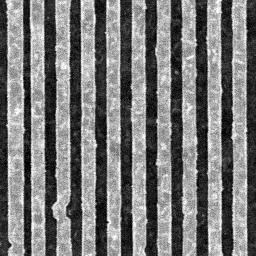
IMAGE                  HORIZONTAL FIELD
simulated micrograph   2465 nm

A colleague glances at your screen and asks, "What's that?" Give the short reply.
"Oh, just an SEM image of parallel lines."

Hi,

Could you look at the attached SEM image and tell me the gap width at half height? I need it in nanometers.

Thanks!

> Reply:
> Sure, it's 123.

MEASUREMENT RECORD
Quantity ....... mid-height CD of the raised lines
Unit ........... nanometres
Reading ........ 123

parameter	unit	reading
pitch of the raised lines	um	0.239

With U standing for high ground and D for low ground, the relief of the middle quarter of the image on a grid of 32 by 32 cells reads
UDDDDUUUDDDUUUDDDUUUDDDUUUDDDDUU
UDDDUUUUDDDUUUDDDUUUDDDUUUDDDDUU
UDDDDUUUDDDUUUDDDUUUDDDUUUDDDDUU
UDDDDUUUDDDUUUDDDUUUDDDUUUUDDDUU
UDDDDUUUDDDUUUDDDUUUDDDUUUUDDDUU
UDDDDUUUDDDUUUDDDUUUDDDUUUDDDDUU
UDDDDUUUDDDUUUDDDUUUDDDUUUDDDDUU
UDDDDUUUDDDUUUDDDUUUDDDUUUDDDDUU
UDDDDUUUDDDUUUDDDUUUDDDUUUDDDDUU
UDDDDUUUDDDUUUDDDUUUDDDDUUDDDDUU
UDDDDUUUDDDUUUDDDUUUDDDDUUDDDDUU
UDDDDUUUDDDUUUDDDUUUDDDDUUDDDDUU
UDDDDUUUDDDUUUDDDUUUDDDDUUDDDDUU
UDDDDUUUDDDUUUDDDUUUDDDUUUDDDDUU
UDDDDUUUDDDUUUDDDUUUDDDUUUUDDDUU
UDDDDUUUDDDUUUDDDUUUDDDDUUUDDDUU
UDDDDUUUDDDUUUDDDUUUDDDDUUUDDDUU
UDDDDUUUDDDUUUDDDUUUDDDDUUUDDDUU
UDDDDUUUDDDUUUDDDUUUDDDDUUUDDDUU
UDDDUUUUDDDUUUDDDUUUDDDDUUUDDDUU
UDDDUUUUDDDUUUDDDUUUDDDDUUDDDDUU
UDDDUUUUDDDUUUDDDUUUDDDDUUDDDDUU
UDDDUUUUDDDUUUDDDUUUDDDDUUDDDDUU
UDDDDUUUDDDUUUDDDUUUDDDUUUDDDDUU
UDDDDUUUDDDUUUDDDUUUDDDUUUUDDDUU
UDDDUUUUDDDUUUDDDUUUDDDUUUUDDDUU
UDDDUUUUDDDUUUDDDUUUDDDDUUUDDDUU
UDDDDUUUDDDUUUDDDUUUDDDDUUUDDDUU
UUDDDUUUDDDUUUDDDUUUDDDDUUUDDDUU
UDDDDUUUDDDUUUDDDUUUDDDDUUUDDDUU
UDDDUUUUDDDUUUDDDUUUDDDDUUUDDDUU
UUDDDUUUDDDUUUDDDUUUDDDDUUUDDDUU